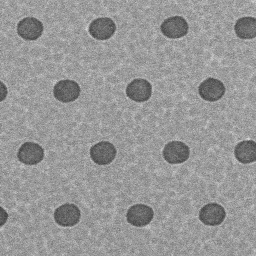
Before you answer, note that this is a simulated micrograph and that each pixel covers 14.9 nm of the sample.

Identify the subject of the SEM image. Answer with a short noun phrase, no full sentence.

a regular array of holes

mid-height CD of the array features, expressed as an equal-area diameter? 392 nm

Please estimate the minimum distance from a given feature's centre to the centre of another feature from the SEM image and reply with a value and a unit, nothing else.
1070 nm